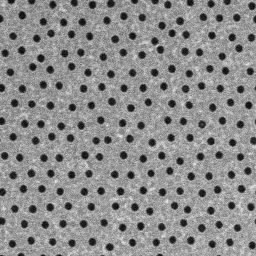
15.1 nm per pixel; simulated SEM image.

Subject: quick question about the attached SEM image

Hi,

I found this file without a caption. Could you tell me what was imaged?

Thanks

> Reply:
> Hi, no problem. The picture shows a regular array of holes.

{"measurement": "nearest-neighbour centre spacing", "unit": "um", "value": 0.247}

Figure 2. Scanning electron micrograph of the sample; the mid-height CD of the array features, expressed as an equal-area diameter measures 125 nm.